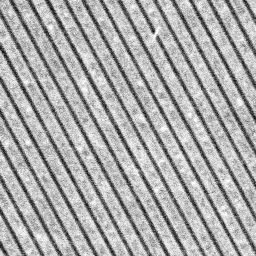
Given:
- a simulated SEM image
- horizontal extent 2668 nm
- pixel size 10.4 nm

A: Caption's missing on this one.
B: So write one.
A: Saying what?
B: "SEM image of parallel lines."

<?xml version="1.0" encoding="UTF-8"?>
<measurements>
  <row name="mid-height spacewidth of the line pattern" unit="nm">52.7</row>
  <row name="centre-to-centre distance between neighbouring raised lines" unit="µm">0.164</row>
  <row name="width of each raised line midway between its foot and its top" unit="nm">106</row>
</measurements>